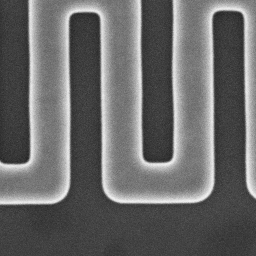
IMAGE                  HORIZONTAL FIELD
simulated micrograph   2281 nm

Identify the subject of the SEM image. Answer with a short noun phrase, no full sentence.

groups of lines, slits or small figures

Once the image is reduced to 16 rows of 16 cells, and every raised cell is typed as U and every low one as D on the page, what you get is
DDUUUUUUUDDUUUUU
DDUUDDUUUDDUUDDU
DDUUDDUUUDDUUDDU
DDUUDDUUUDDUUDDU
DDUUDDUUUDDUUDDU
DDUUDDUUUDDUUDDU
DDUUDDUUUDDUUDDU
DDUUDDUUUDDUUDDU
DDUUDDUUUDDUUDDU
DDUUDDUUUDDUUDDU
UUUUDDUUUUUUUDDU
UUUUDDUUUUUUUDDU
UUUUDDDUUUUUUDDD
DDDDDDDDDDDDDDDD
DDDDDDDDDDDDDDDD
DDDDDDDDDDDDDDDD